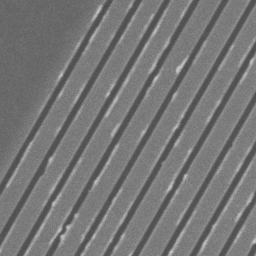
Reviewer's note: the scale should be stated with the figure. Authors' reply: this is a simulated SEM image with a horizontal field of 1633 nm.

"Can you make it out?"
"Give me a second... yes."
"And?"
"parallel lines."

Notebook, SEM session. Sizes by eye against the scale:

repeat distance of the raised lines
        0.16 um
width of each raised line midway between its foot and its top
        115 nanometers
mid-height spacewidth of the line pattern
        6.6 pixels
